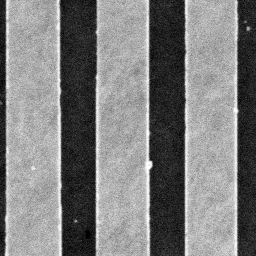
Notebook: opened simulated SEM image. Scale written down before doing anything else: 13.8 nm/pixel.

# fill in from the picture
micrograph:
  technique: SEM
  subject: lines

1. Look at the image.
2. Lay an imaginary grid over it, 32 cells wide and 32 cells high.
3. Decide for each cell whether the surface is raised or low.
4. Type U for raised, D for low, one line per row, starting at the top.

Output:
DUUUUUUDDDDDUUUUUUUDDDDUUUUUUUDD
DUUUUUUDDDDDUUUUUUUDDDDUUUUUUUDD
DUUUUUUDDDDDUUUUUUUDDDDUUUUUUUDD
DUUUUUUDDDDDUUUUUUUDDDDUUUUUUUDD
DUUUUUUDDDDDUUUUUUUDDDDUUUUUUUDD
DUUUUUUDDDDDUUUUUUUDDDDUUUUUUUDD
DUUUUUUDDDDDUUUUUUUDDDDUUUUUUUDD
DUUUUUUDDDDDUUUUUUUDDDDUUUUUUUDD
DUUUUUUDDDDDUUUUUUUDDDDUUUUUUUDD
DUUUUUUDDDDDUUUUUUUDDDDUUUUUUUDD
DUUUUUUDDDDDUUUUUUUDDDDUUUUUUUDD
DUUUUUUDDDDDUUUUUUUDDDDUUUUUUUDD
DUUUUUUDDDDDUUUUUUUDDDDUUUUUUUDD
DUUUUUUDDDDDUUUUUUUDDDDUUUUUUUDD
DUUUUUUDDDDDUUUUUUUDDDDUUUUUUUDD
DUUUUUUDDDDDUUUUUUUDDDDUUUUUUUDD
DUUUUUUDDDDDUUUUUUUDDDDUUUUUUUDD
DUUUUUUDDDDDUUUUUUUDDDDUUUUUUUDD
DUUUUUUDDDDDUUUUUUUDDDDUUUUUUUDD
DUUUUUUDDDDDUUUUUUUDDDDUUUUUUUDD
DUUUUUUDDDDDUUUUUUUDDDDUUUUUUUDD
DUUUUUUDDDDDUUUUUUUDDDDUUUUUUUDD
DUUUUUUDDDDDUUUUUUUDDDDUUUUUUUDD
DUUUUUUDDDDDUUUUUUUDDDDUUUUUUUDD
DUUUUUUDDDDDUUUUUUUDDDDUUUUUUUDD
DUUUUUUUDDDDUUUUUUUDDDDUUUUUUUDD
DUUUUUUUDDDDUUUUUUUDDDDUUUUUUUDD
DUUUUUUUDDDDUUUUUUUDDDDUUUUUUUDD
DUUUUUUUDDDDUUUUUUUDDDDUUUUUUUDD
DUUUUUUUDDDDUUUUUUUDDDDUUUUUUUDD
DUUUUUUUDDDDUUUUUUUDDDDUUUUUUUDD
DUUUUUUUDDDDUUUUUUUDDDDUUUUUUUDD